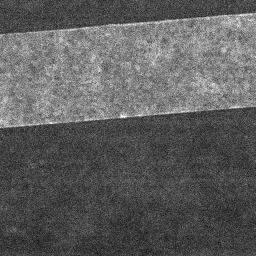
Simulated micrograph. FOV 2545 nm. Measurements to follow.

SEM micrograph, one or a few lines or trenches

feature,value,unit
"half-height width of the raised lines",921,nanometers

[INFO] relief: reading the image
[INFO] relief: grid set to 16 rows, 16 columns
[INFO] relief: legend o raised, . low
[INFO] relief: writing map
................
........oooooooo
oooooooooooooooo
ooooooooooooooo.
oooooooooooooooo
oooooooooooooooo
oooooooooooooooo
oooooo..........
................
................
................
................
................
................
................
................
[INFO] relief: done